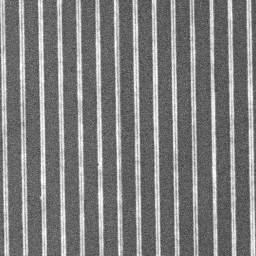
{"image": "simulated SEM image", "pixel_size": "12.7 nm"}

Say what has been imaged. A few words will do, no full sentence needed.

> parallel lines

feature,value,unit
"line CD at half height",33.4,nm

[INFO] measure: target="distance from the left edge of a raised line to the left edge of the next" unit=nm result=241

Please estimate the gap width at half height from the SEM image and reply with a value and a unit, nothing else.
16.3 px